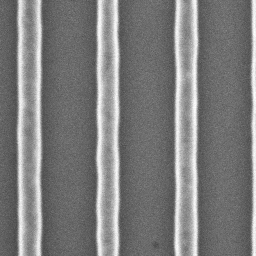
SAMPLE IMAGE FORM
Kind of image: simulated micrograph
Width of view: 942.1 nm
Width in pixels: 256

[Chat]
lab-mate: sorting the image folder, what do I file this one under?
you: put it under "wiring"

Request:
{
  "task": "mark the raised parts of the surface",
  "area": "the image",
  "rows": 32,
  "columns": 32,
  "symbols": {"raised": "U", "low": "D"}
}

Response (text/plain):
DDDUUDDDDDDDUUUDDDDDDDUUDDDDDDDD
DDDUUDDDDDDDUUUDDDDDDDUUDDDDDDDD
DDUUUDDDDDDDUUUDDDDDDDUUDDDDDDDD
DDDUUDDDDDDDUUUDDDDDDDUUDDDDDDDD
DDDUUDDDDDDDUUUDDDDDDDUUUDDDDDDD
DDDUUDDDDDDDUUUDDDDDDDUUUDDDDDDD
DDDUUDDDDDDDUUUDDDDDDDUUUDDDDDDD
DDDUUDDDDDDDUUUDDDDDDDUUDDDDDDDD
DDDUUDDDDDDDUUUDDDDDDDUUDDDDDDDD
DDDUUDDDDDDDUUUDDDDDDDUUDDDDDDDD
DDDUUDDDDDDDUUUDDDDDDDUUDDDDDDDD
DDDUUDDDDDDDUUUDDDDDDDUUDDDDDDDD
DDDUUDDDDDDDUUUDDDDDDDUUDDDDDDDD
DDDUUDDDDDDDUUUDDDDDDDUUDDDDDDDD
DDDUUDDDDDDDUUUDDDDDDDUUDDDDDDDD
DDUUUDDDDDDDUUUDDDDDDDUUDDDDDDDD
DDUUUDDDDDDDUUUDDDDDDDUUDDDDDDDD
DDUUUDDDDDDDUUUDDDDDDDUUDDDDDDDD
DDDUUDDDDDDDUUUDDDDDDDUUDDDDDDDD
DDDUUDDDDDDDUUUDDDDDDDUUDDDDDDDD
DDDUUDDDDDDDUUUDDDDDDDUUDDDDDDDD
DDDUUDDDDDDDUUUDDDDDDDUUDDDDDDDD
DDDUUDDDDDDDUUUDDDDDDDUUDDDDDDDD
DDDUUDDDDDDDUUUDDDDDDDUUDDDDDDDD
DDDUUDDDDDDDUUUDDDDDDDUUDDDDDDDD
DDDUUDDDDDDDUUUDDDDDDDUUDDDDDDDD
DDDUUDDDDDDDUUUDDDDDDDUUDDDDDDDD
DDDUUDDDDDDDUUUDDDDDDDUUUDDDDDDD
DDDUUDDDDDDDUUUDDDDDDDUUUDDDDDDD
DDDUUDDDDDDDUUUDDDDDDDUUUDDDDDDD
DDDUUDDDDDDDUUUDDDDDDDUUDDDDDDDD
DDDUUDDDDDDDUUUDDDDDDDUUDDDDDDDD